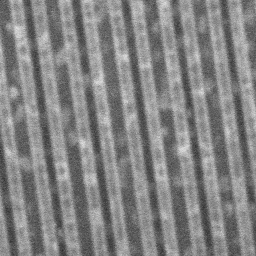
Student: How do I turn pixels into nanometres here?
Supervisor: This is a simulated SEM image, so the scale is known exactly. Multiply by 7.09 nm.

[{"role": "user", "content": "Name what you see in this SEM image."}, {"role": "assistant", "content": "parallel lines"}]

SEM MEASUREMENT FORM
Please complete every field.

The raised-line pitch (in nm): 172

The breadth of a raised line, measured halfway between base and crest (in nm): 81.6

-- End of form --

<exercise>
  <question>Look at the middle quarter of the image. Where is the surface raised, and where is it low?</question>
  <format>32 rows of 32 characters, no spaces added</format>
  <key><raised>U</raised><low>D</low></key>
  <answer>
DUUUDDDUUDDDDDUUDDDUUUDDDDUUUDDU
DUUUDDDUUDDDDDUUDDDUUUDDDDUUUDDU
DUUUDDDUUUDDDDUUUDDUUUDDDDUUUDDU
DDUUDDDUUUDDDDUUUDDUUUDDDDUUUDDD
DDUUUDDUUUDDDDUUUDDUUUDDDDUUUDDD
DDUUUDDUUUDDDDUUUDDDUUDDDDDUUDDD
DDUUUDDDUUDDDDUUUDDDUUUDDDDUUUDD
DDUUUDDDUUDDDDDUUDDDUUUDDDDUUUDD
DDUUUDDDUUDDDDDUUDDDUUUDDDDUUUDD
DDUUUDDDUUUDDDDUUUDDUUUDDDDUUUDD
DDDUUDDDUUUDDDDUUUDDUUUDDDDUUUDD
DDDUUUDDUUUDDDDUUUDDUUUDDDDUUUDD
DDDUUUDDUUUDDDDUUUDDDUUUDDDDUUDD
DDDUUUDDDUUDDDDUUUDDDUUUDDDDUUDD
DDDUUUDDDUUDDDDDUUDDDUUUDDDDUUUD
DDDUUUDDDUUDDDDDUUDDDUUUDDDDUUUD
DDDUUUDDDUUUDDDDUUUDDUUUDDDDUUUD
DDDDUUDDDUUUDDDDUUUDDUUUDDDDUUUD
DDDDUUUDDUUUDDDDUUUDDUUUDDDDUUUD
DDDDUUUDDUUUDDDDUUUDDDUUUDDDDUUD
DDDDUUUDDUUUDDDDUUUDDDUUUDDDDUUD
DDDDUUUDDDUUDDDDDUUDDDUUUDDDDUUU
DDDDUUUDDDUUDDDDDUUDDDUUUDDDDUUU
DDDDDUUDDDUUUDDDDUUUDDUUUDDDDUUU
UDDDDUUDDDUUUDDDDUUUDDUUUDDDDUUU
UDDDDUUUDDUUUDDDDUUUDDUUUDDDDUUU
UDDDDUUUDDUUUDDDDUUUDDDUUDDDDDUU
UDDDDUUUDDUUUDDDDUUUDDDUUDDDDDUU
UDDDDUUUDDDUUDDDDDUUDDDUUUDDDDUU
UUDDDUUUDDDUUDDDDDUUDDDUUUDDDDUU
UUDDDDUUDDDUUUDDDDUUUDDUUUDDDDUU
UUDDDDUUDDDUUUDDDDUUUDDUUUDDDDUU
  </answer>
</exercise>